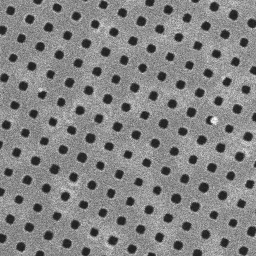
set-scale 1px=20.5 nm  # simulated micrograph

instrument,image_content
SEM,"a regular array of holes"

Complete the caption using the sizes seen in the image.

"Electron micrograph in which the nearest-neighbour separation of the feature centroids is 418 nm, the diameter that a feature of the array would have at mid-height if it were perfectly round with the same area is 204 nanometres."